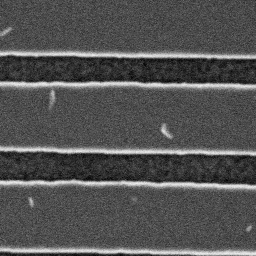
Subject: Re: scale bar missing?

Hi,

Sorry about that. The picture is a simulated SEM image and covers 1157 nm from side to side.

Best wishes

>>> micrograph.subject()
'lines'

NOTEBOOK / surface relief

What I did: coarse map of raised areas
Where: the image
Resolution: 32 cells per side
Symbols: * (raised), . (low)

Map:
********************************
********************************
********************************
********************************
********************************
********************************
********************************
................................
................................
................................
******************.*...*........
********************************
********************************
********************************
********************************
********************************
********************************
********************************
********************************
................................
................................
................................
................................
********************************
********************************
********************************
********************************
********************************
********************************
********************************
********************************
............********************